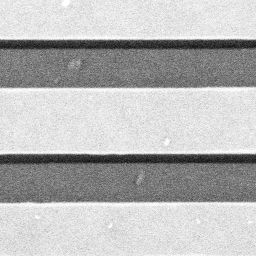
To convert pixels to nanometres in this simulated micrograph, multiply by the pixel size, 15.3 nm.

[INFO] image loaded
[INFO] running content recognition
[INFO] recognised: lines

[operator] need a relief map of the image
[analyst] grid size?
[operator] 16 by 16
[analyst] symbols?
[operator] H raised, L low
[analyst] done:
HHHHHHHHHHHHHHHH
HHHHHHHHHHHHHHHH
LLLLLLLLLLLLLLLL
LLLLLLLLLLLLLLLL
LLLLLLLLLLLLLLLL
LLLLLLLLLLLLHHHH
HHHHHHHHHHHHHHHH
HHHHHHHHHHHHHHHH
HHHHHHHHHHHHHHHH
HHHHHHHHHHHHHHHH
LLLLLLLLLLLLLLLL
LLLLLLLLLLLLLLLL
LLLLLLLLLLLLLLLL
HHHHHHHHHHHHHHHH
HHHHHHHHHHHHHHHH
HHHHHHHHHHHHHHHH